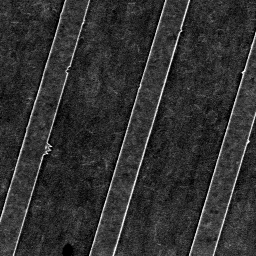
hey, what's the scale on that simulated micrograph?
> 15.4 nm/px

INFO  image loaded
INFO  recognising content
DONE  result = one or a few lines or trenches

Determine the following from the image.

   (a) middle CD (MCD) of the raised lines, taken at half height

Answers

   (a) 0.36 µm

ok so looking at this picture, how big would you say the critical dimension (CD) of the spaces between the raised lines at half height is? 1120 nanometers